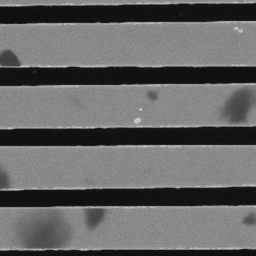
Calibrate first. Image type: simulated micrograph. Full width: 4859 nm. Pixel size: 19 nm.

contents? lines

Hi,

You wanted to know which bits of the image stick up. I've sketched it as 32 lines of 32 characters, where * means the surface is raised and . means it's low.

****************................
................................
................................
********************************
********************************
********************************
********************************
********************************
................................
................................
.........................*******
********************************
********************************
********************************
********************************
********************************
................................
................................
********************************
********************************
********************************
********************************
********************************
********************..*.........
................................
................................
********************************
********************************
********************************
********************************
********************************
................................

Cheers